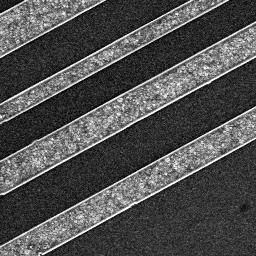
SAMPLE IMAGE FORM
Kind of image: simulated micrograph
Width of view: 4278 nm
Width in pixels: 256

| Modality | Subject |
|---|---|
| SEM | parallel lines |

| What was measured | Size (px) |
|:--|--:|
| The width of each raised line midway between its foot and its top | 28.1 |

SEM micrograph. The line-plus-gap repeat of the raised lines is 1110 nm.